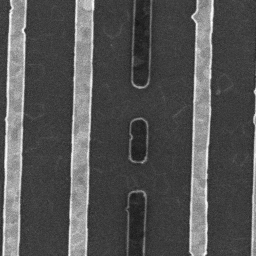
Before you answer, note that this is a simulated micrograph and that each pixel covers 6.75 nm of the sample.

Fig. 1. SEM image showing one or a few lines or trenches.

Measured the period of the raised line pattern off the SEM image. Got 420 nanometres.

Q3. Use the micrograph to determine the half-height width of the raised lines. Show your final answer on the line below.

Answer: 108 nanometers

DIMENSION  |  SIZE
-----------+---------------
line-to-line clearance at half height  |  310 nanometers